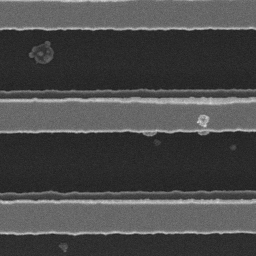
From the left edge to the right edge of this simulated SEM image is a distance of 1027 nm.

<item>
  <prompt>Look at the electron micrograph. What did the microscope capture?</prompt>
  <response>lines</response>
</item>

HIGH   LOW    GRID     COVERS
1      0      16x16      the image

1111111111111111
1111111111111111
0000000000000000
0000000000000000
0000000000000000
0000000000000000
1111111111111111
1111111111111111
0000000000000000
0000000000000000
0000000000000000
0000000000000000
0000000011011101
1111111111111111
1111111111111111
0000000000000000